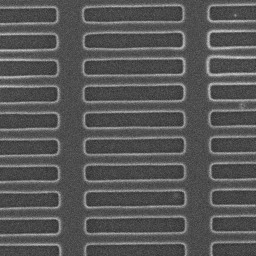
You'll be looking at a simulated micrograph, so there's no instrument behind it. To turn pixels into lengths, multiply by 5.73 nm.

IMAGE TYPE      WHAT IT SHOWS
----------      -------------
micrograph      groups of lines, slits or small figures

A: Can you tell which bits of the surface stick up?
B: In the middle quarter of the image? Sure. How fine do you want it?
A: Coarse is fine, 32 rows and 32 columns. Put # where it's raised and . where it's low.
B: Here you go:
#####.........................##
#####.........................##
#####........................###
################################
################################
######........................##
#####.........................##
#####.........................##
#####.........................##
################################
################################
################################
#####.........................##
#####.........................##
#####.........................##
######........................##
################################
################################
############################.###
#####.........................##
#####.........................##
#####.........................##
######.....................#####
################################
################################
######........................##
#####.........................##
#####.........................##
#####.........................##
################################
################################
################################